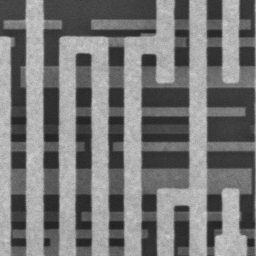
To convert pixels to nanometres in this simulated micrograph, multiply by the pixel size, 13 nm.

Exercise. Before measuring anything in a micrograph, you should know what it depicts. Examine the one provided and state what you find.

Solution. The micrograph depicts wiring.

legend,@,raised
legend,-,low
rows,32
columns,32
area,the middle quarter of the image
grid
@@@----@@@@----@@@@----@@@@@----
@@@----@@@@----@@@@----@@@@@----
@@@----@@@@----@@@@----@@@@@----
@@@----@@@@----@@@@----@@@@@----
@@@----@@@@----@@@@-----@@@-----
@@@----@@@@----@@@@-------------
@@@----@@@@----@@@@-------------
@@@----@@@@----@@@@-------------
@@@----@@@@----@@@@-------------
@@@----@@@@----@@@@-------------
@@@----@@@@----@@@@-------------
@@@----@@@@----@@@@-------------
@@@----@@@@----@@@@-------------
@@@----@@@@----@@@@-------------
@@@----@@@@----@@@@-------------
@@@----@@@@----@@@@-------------
@@@----@@@@----@@@@-------------
@@@----@@@@----@@@@-------------
@@@----@@@@----@@@@-------------
@@@----@@@@----@@@@-------------
@@@----@@@@----@@@@-------------
@@@----@@@@----@@@@-------------
@@@----@@@@----@@@@-------------
@@@----@@@@----@@@@-------------
@@@----@@@@----@@@@-------------
@@@----@@@@----@@@@-------------
@@@----@@@@----@@@@-------------
@@@----@@@@----@@@@-------------
@@@----@@@@----@@@@-------------
@@@----@@@@----@@@@-------------
@@@----@@@@----@@@@------------@
@@@----@@@@----@@@@-----@@@@@@@@